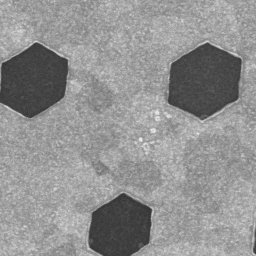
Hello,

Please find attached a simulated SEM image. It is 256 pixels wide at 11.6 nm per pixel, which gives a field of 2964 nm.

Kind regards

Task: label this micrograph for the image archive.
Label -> holes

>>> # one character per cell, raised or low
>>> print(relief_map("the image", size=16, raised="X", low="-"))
XXXXXXXXXXXXXXXX
XXXXXXXXXXXXXXXX
XXXXXXXXXXXXXXXX
X---XXXXXXX----X
----XXXXXXX----X
----XXXXXX-----X
---XXXXXXXX---XX
XXXXXXXXXXXXXXXX
XXXXXXXXXXXXXXXX
XXXXXXXXXXXXXXXX
XXXXXXXXXXXXXXXX
XXXXXXXXXXXXXXXX
XXXXXXX--XXXXXXX
XXXXXX---XXXXXXX
XXXXXX---XXXXXXX
XXXXXX---XXXXXXX